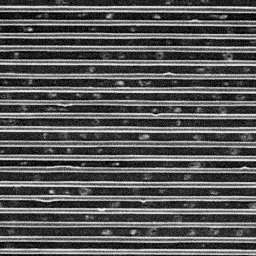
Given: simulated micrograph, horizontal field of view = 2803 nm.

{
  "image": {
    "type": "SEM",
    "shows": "parallel lines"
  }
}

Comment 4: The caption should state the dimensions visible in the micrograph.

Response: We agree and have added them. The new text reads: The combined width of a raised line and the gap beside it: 147 nanometers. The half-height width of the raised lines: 47.9 nm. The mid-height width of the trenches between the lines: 97.1 nm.